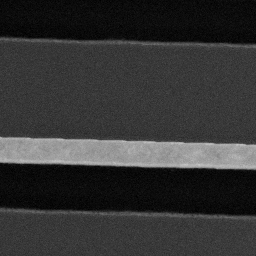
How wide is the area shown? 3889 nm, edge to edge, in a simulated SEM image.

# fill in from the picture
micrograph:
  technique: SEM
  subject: lines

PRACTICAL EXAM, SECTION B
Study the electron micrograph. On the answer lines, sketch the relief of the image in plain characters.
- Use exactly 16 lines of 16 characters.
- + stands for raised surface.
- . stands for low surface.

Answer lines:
................
................
+...............
++++++++++++++++
++++++++++++++++
++++++++++++++++
++++++++++++++++
++++++++++++++++
++++++++++++++++
++++++++++++++++
.............+++
................
................
++++++++++++....
++++++++++++++++
++++++++++++++++